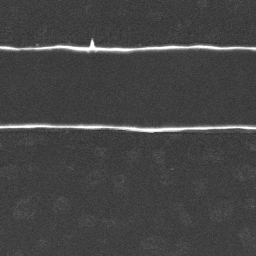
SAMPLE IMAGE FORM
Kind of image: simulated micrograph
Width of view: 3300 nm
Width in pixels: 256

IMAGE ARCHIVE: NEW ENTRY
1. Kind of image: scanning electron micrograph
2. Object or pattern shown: one or a few lines or trenches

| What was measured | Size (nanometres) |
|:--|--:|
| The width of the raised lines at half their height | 1030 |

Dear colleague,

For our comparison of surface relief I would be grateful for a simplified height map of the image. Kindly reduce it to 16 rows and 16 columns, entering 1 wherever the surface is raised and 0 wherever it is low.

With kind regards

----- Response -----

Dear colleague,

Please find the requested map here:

0000000000000000
0000000000000000
0000000000000000
1111111111111111
1111111111111111
1111111111111111
1111111111111111
1111111111111111
0000000000000000
0000000000000000
0000000000000000
0000000000000000
0000000000000000
0000000000000000
0000000000000000
0000000000000000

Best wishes